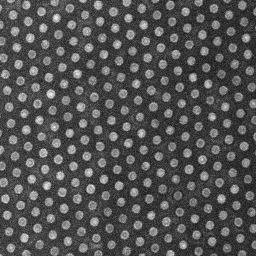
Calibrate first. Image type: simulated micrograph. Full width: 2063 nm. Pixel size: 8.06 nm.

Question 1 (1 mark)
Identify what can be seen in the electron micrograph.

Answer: a regular array of raised bodies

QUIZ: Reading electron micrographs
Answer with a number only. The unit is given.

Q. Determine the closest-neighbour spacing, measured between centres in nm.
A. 132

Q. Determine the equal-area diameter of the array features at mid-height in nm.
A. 62.3